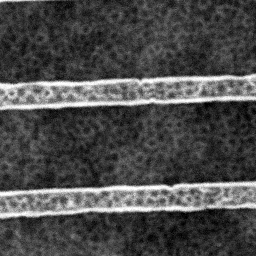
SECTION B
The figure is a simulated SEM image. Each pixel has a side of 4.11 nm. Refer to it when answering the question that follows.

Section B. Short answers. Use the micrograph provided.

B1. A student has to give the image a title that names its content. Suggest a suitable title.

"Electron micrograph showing one or a few lines or trenches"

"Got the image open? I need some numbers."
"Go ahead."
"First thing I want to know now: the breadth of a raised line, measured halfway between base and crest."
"90 nanometers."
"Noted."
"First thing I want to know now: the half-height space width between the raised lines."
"348 nm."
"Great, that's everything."